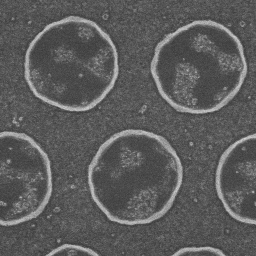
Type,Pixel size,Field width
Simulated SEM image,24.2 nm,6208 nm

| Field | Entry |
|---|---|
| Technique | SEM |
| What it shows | raised bodies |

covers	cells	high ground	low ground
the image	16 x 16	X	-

----------------
---XXX------X---
--XXXXX---XXXXX-
--XXXXX---XXXXX-
--XXXXX---XXXXX-
--XXXXX---XXXXX-
----XX-----XXX--
----------------
X------XXX------
XXX---XXXXX---XX
XXX---XXXXX---XX
XXX---XXXXX---XX
XXX---XXXXX---XX
XX-----XXX-----X
----------------
----X-----------